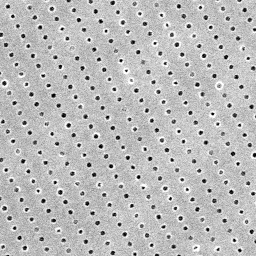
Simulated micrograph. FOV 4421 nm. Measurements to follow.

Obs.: a regular array of holes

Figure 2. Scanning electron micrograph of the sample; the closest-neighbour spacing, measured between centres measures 11 pixels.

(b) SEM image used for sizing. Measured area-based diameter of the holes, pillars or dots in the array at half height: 82.7 nanometres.